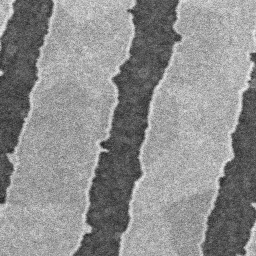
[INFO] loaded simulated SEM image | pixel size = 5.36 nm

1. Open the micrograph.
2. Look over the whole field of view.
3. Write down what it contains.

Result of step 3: one or a few lines or trenches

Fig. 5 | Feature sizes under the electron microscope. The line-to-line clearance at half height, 238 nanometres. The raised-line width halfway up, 427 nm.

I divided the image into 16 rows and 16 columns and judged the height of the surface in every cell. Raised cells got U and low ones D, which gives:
UDDUUUUUDDDUUUUU
DDDUUUUUDDDUUUUU
DDDUUUUUDDDUUUUU
DDDUUUUUDDDUUUUU
DDUUUUUDDDUUUUUU
DDUUUUUDDDUUUUUD
DDUUUUUDDUUUUUUD
DDUUUUUDDUUUUUUD
DUUUUUUDDUUUUUDD
DUUUUUDDDUUUUUDD
DUUUUUDDDUUUUUDD
DUUUUUDDDUUUUUDD
UUUUUDDDUUUUUDDD
UUUUUDDDUUUUUDDD
UUUUUDDDUUUUUDDD
UUUUUDDDUUUUUDDU